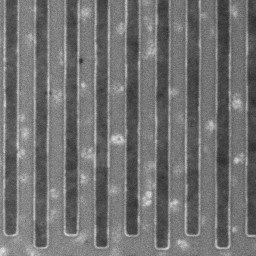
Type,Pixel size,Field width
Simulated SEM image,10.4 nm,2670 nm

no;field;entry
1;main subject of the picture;parallel lines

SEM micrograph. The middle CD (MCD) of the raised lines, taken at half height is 0.141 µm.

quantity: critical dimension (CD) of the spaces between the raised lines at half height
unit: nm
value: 169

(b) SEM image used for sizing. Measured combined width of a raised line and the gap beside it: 316 nanometers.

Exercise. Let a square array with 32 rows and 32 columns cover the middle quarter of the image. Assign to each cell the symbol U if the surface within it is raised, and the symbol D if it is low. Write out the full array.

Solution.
UUUUDDDDUUUDDDDDUUUDDDDUUUDDDDDU
UUUUDDDDUUUDDDDDUUUDDDDUUUDDDDDU
UUUUDDDDUUUDDDDDUUUDDDDUUUDDDDDU
UUUDDDDDUUUDDDDDUUUDDDDUUUDDDDDU
UUUDDDDDUUUDDDDDUUUDDDDUUUDDDDDU
UUUDDDDDUUUDDDDDUUUDDDDUUUDDDDDU
UUUDDDDDUUUDDDDDUUUDDDDUUUDDDDDU
UUUDDDDDUUUDDDDDUUUDDDDUUUDDDDDU
UUUDDDDDUUUDDDDDUUUDDDDUUUDDDDDU
UUUDDDDDUUUDDDDDUUUDDDDUUUDDDDDU
UUUDDDDDUUUDDDDDUUUDDDDUUUDDDDDU
UUUDDDDDUUUDDDDDUUUDDDDUUUDDDDDU
UUUDDDDDUUUDDDDDUUUDDDDUUUDDDDDU
UUUDDDDDUUUDDDDDUUUDDDDUUUDDDDDU
UUUDDDDDUUUDDDDDUUUDDDDUUUDDDDDU
UUUDDDDDUUUDDDDDUUUDDDDUUUDDDDDU
UUUDDDDDUUUDDDDDUUUDDDDUUUDDDDDU
UUUDDDDDUUUDDDDDUUUDDDDUUUDDDDDU
UUUDDDDDUUUDDDDDUUUDDDDUUUDDDDUU
UUUDDDDDUUUDDDDDUUUDDDDUUUDDDDDU
UUUDDDDDUUUDDDDDUUUDDDDUUUDDDDDU
UUUDDDDDUUUDDDDDUUUDDDDUUUDDDDDU
UUUDDDDDUUUDDDDDUUUDDDDUUUDDDDDU
UUUUDDDDUUUDDDDDUUUDDDDUUUDDDDDU
UUUDDDDDUUUDDDDDUUUDDDDUUUDDDDDU
UUUDDDDDUUUDDDDDUUUDDDDUUUDDDDDU
UUUDDDDDUUUDDDDDUUUDDDDUUUDDDDDU
UUUDDDDDUUUDDDDDUUUDDDDUUUDDDDDU
UUUDDDDDUUUDDDDDUUUDDDDUUUDDDDDU
UUUDDDDDUUUDDDDDUUUDDDDUUUDDDDDU
UUUDDDDDUUUDDDDDUUUDDDDUUUDDDDDU
UUUDDDDDUUUDDDDUUUUDDDDUUUDDDDDU